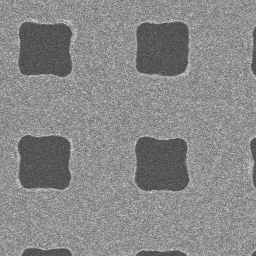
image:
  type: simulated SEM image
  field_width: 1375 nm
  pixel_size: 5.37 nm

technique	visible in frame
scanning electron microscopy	holes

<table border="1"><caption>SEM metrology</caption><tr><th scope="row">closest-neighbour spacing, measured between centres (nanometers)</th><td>614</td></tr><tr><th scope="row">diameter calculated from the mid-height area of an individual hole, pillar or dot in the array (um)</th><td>0.311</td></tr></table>